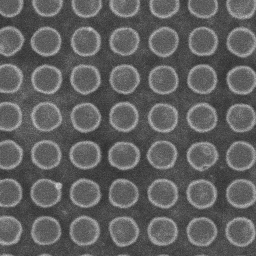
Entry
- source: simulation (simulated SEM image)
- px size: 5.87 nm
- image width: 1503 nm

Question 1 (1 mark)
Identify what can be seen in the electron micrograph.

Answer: a regular array of raised bodies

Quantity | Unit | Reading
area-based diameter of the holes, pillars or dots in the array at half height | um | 0.168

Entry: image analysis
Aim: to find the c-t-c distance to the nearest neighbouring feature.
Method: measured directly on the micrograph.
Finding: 0.221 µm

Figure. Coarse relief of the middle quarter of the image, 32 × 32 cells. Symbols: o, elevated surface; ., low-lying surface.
....ooo........o................
..oooooo....oooooo.....oooo.....
..ooooooo...oooooo....oooooo...o
..ooooooo...ooooooo..ooooooo...o
..ooooooo...ooooooo..ooooooo...o
..oooooo....oooooo...ooooooo...o
...ooooo.....oooo.....oooooo....
................................
................................
................................
....oooo.....oooo.....oooo......
..oooooo....oooooo....oooooo....
..ooooooo...oooooo...ooooooo...o
..ooooooo...oooooo...ooooooo...o
..ooooooo...oooooo...ooooooo...o
...ooooo....oooooo....oooooo....
....ooo.......oo.......ooo......
................................
................................
.......................ooo......
...ooooo....oooooo....ooooo.....
..ooooooo..ooooooo...ooooooo...o
..ooooooo..oooooooo..ooooooo...o
..ooooooo..oooooooo..ooooooo...o
..oooooo...ooooooo...oooooo....o
...oooo.....oooooo....ooooo.....
................................
................................
................................
...oooo.....oooo.......oooo.....
..oooooo....oooooo....oooooo...o
..ooooooo..ooooooo...ooooooo...o